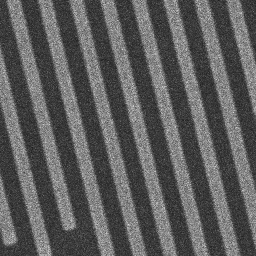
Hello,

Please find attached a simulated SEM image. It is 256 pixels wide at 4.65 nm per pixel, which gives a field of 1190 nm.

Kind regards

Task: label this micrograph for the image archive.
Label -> parallel lines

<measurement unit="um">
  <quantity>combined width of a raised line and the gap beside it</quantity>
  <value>0.142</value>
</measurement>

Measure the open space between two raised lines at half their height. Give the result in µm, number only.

0.0819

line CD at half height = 58.7 nm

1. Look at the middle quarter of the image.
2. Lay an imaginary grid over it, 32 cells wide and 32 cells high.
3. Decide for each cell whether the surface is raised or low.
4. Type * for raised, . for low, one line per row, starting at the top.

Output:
*....****....***.....***.....***
*.....***....****.....***....***
*.....***.....***.....***.....**
**....***.....***.....***.....**
**....****....***.....***.....**
**.....***....****.....***....**
**.....***.....***.....***.....*
***....***.....***.....***.....*
***....****....***.....***.....*
***.....***....****.....**.....*
***.....***.....***.....***.....
****....***.....***.....***.....
.***....****....***.....***.....
.***.....***....****....***.....
.***.....***.....***.....***....
.****....***.....***.....***....
..***....****....***.....***....
..***.....***....****....***....
..***.....***.....***.....***...
..****....***.....***.....***...
...***....****....***.....***...
...***.....***....****....***...
...***.....***.....***.....***..
...****....***.....***.....***..
....***....****....***.....***..
....***.....***....****....***..
....***.....***.....***.....***.
....****....***.....***.....***.
.....***....****....***.....***.
.....***.....***....****....***.
*....***.....***.....***.....***
*....****....***.....***.....***